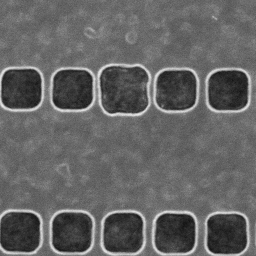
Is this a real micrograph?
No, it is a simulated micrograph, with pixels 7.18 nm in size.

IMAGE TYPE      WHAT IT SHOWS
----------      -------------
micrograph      a regular array of holes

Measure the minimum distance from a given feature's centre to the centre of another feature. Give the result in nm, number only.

370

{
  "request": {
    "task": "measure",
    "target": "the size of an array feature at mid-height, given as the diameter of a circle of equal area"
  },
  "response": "320 nm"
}